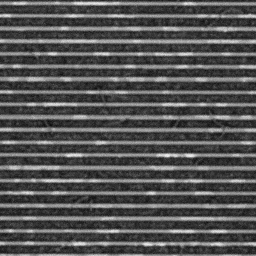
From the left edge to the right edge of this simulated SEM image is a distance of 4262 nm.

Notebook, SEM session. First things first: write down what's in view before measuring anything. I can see parallel lines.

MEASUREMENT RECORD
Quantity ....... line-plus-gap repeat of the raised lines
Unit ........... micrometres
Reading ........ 0.21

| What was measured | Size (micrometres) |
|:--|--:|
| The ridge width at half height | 0.0437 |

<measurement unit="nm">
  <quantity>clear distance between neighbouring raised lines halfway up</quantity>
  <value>162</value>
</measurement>